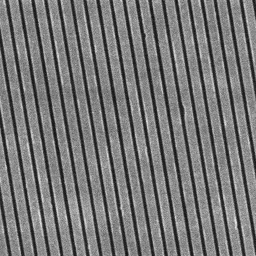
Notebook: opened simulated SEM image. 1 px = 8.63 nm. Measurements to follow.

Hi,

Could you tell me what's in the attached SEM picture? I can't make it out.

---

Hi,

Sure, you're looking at parallel lines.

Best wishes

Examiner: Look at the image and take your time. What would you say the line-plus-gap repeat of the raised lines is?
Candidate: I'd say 111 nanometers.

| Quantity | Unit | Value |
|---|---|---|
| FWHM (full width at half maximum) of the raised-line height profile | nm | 75.5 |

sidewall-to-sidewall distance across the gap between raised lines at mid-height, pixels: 3.82